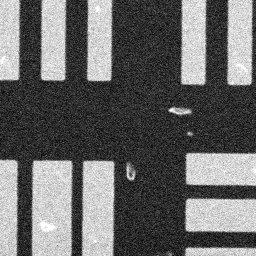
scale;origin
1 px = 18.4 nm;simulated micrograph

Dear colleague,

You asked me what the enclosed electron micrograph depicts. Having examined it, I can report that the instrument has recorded groups of lines, slits or small figures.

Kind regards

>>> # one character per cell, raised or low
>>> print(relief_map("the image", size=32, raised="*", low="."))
**...***...***.........***...**.
**...***...***.........***...**.
**...***...***.........***...**.
**...***...***.........***...**.
**...***...***.........***...**.
**...***...***.........***...**.
**...***...***.........***...**.
**...***...***.........***...**.
**...***...***.........***...**.
**...***...***.........***...**.
.............................**.
................................
................................
................................
................................
................................
................................
................................
................................
........................********
**..*****.****.........*********
**..*****.****..*......*********
**..*****.****.........*********
**..*****.****..................
**..*****.****..................
**..*****.****.........*********
**..*****.****.........*********
**..*****.****.........*********
**..*****.****.........*********
**..*****.****..................
**..*****.****..................
**..*****.****.........*********